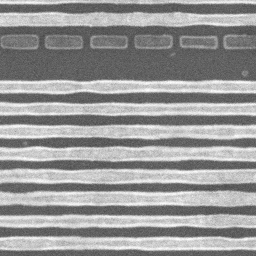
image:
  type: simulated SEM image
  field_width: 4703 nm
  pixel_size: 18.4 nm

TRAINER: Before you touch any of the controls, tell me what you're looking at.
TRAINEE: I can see wiring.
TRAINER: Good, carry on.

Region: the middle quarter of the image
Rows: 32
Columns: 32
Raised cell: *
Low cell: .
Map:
................................
................................
................................
................................
................................
********************************
********************************
................................
................................
................................
********************************
********************************
..........****..................
................................
................................
................................
********************************
********************************
................................
................................
................................
*****************************...
********************************
*****************************...
................................
................................
................................
********************************
********************************
....************..............**
................................
................................